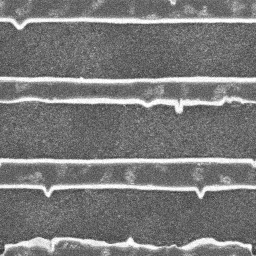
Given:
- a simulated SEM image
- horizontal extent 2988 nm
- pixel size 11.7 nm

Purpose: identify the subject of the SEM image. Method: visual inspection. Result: one or a few lines or trenches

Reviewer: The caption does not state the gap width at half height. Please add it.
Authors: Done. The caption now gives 57.8 pixels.